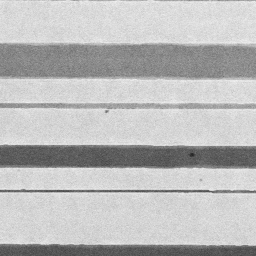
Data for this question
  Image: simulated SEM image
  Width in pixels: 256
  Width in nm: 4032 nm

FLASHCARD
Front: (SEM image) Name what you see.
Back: lines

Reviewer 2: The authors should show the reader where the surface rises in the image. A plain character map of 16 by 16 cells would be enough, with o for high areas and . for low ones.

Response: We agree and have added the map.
oooooooooooooooo
oooooooooooooooo
oooooooooooooooo
................
................
oooooooooooooooo
oooooooooooooooo
oooooooooooooooo
oooooooooooooooo
................
o...............
oooooooooooooooo
oooooooooooooooo
oooooooooooooooo
oooooooooooooooo
................